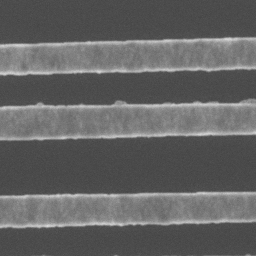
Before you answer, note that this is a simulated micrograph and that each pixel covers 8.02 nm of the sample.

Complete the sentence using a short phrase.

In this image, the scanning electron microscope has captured lines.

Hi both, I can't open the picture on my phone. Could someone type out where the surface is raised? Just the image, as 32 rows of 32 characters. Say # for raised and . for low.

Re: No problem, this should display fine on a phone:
................................
................................
................................
................................
................................
.......#########################
################################
################################
################################
................................
................................
................................
................................
################################
################################
################################
################################
................................
................................
................................
................................
................................
................................
................................
...#############################
################################
################################
################################
................................
................................
................................
................................